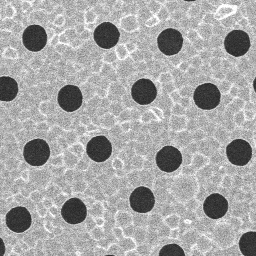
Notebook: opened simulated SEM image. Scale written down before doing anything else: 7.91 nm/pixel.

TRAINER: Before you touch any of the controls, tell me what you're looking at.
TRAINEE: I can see a regular array of holes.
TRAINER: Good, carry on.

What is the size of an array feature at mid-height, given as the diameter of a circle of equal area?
210 nanometres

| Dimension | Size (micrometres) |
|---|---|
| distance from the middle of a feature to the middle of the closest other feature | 0.462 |